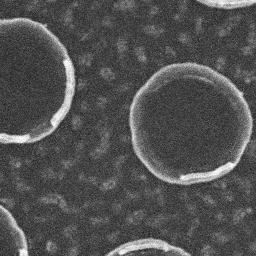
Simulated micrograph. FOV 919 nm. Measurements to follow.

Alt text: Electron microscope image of raised bodies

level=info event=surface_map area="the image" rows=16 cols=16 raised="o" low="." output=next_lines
................
oo..............
ooo.............
oooo............
oooo......ooo...
oooo.....oooooo.
oooo....ooooooo.
oooo....oooooooo
ooo.....ooooooo.
.........oooooo.
.........ooooo..
................
................
o...............
o...............
oo......ooo.....